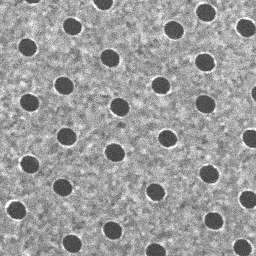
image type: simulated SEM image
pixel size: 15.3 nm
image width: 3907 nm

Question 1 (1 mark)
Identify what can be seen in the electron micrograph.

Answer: a regular array of holes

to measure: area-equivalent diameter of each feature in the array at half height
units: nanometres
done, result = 298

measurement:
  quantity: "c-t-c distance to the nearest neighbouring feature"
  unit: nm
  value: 700